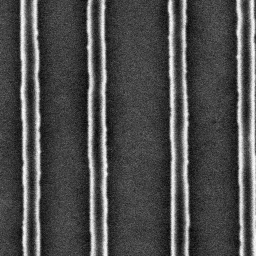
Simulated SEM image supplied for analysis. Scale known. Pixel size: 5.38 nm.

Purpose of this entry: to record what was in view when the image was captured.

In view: lines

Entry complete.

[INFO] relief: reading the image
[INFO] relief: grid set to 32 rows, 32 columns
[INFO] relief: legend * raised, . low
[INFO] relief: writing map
...**......**........**.......**
...**......**........**.......**
...**......**........**.......**
...**......**........**.......**
...**......**........**.......**
...**......**........**.......**
...**......**........**.......**
...**......**........**.......**
...**......**........**.......**
...**......**........**.......**
...**......**........**.......**
...**......**........**.......**
...**......**........**.......**
...**......**........**.......**
...**......**........**.......**
...**......**........**.......**
...**......**........**.......**
...**......**........**.......**
...**......**........**.......**
...**......**.........*.......**
...**......**........**.......**
...**......**........**.......**
...**......**........**.......**
...**......**........**.......**
...**......**........**.......**
...**......**........**.......**
...**......**........**.......**
...**......**........***......**
...**......**........***......**
...**......**........**.......**
...**......**........**.......**
...**......**.........*.......**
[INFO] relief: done